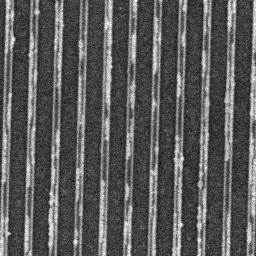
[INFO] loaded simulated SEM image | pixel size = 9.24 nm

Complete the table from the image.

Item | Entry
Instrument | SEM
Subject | parallel lines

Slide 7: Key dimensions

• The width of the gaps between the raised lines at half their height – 164 nm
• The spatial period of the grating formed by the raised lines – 228 nm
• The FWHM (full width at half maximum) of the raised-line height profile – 63.5 nanometres